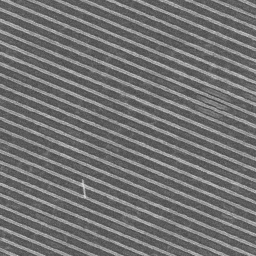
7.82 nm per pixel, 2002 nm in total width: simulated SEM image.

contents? parallel lines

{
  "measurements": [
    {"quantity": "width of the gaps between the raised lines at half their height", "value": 60.5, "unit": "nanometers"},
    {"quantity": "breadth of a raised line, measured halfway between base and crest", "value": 19.9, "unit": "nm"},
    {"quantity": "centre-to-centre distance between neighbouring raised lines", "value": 78.9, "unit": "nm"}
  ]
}